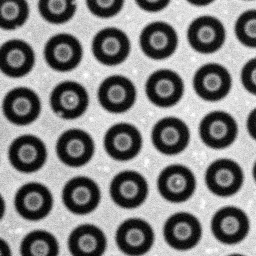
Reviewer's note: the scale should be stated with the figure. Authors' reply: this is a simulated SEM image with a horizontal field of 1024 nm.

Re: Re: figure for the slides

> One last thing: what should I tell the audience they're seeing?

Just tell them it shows an array of small figures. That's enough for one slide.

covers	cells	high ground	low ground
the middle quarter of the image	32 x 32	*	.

....******...*******************
..*********************....*****
*************.********.......***
**********......*****.........**
....*****........***....**....**
.....****.........**...****...**
......**...****...**...****...**
***...**...****...**....***...**
***...**....***...***.........**
***...**..........***........***
***...***........*****......****
......****.......***************
.....*******..******************
....********************.....***
*************...*******.......**
************......****.........*
.....******........***...***....
.......***.........***...***....
.......***...***....*....***....
..**....**...****...**...***....
.****...**...***....**.........*
.****...**....*....****.......**
.***....***........*****.....***
.......*****......**************
.......*******..****************
.....********************......*
***************...******........
*************.......***.........
**.....*****........***...****..
........***.....*....**...****..
.........**...****...**...****..
...***...**...****...**....**...